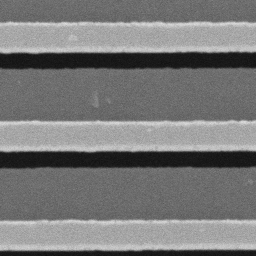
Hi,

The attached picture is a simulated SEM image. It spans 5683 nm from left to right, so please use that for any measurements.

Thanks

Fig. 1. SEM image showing lines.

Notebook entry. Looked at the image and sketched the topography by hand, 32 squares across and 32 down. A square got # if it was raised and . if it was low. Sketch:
################################
################################
################################
################################
################################
################################
########################.#######
................................
..............................#.
################################
################################
################################
################################
################################
################################
################################
################################
################################
################################
................................
................................
################################
################################
################################
################################
################################
################################
################################
################################
################################
################################
................................